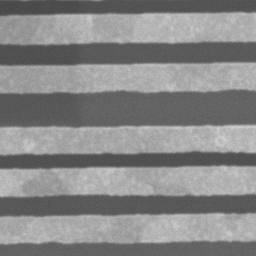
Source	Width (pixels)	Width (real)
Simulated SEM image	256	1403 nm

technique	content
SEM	lines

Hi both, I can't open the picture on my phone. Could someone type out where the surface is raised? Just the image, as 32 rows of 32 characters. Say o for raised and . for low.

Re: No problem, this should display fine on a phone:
................................
................................
oooooooooooooooooooooooooooooooo
oooooooooooooooooooooooooooooooo
oooooooooooooooooooooooooooooooo
..o..o..........................
................................
................................
oooooooooooooooooooooooooooooooo
oooooooooooooooooooooooooooooooo
oooooooooooooooooooooooooooooooo
ooooooo.oooo......o.............
................................
................................
................................
................................
oooooooooooooooooooooooooooooooo
oooooooooooooooooooooooooooooooo
oooooooooooooooooooooooooooooooo
................................
................................
oooooooooooooooooooooooooooooooo
oooooooooooooooooooooooooooooooo
oooooooooooooooooooooooooooooooo
oooooo..........................
................................
................................
oooooooooooooooooooooooooooooooo
oooooooooooooooooooooooooooooooo
oooooooooooooooooooooooooooooooo
................................
................................